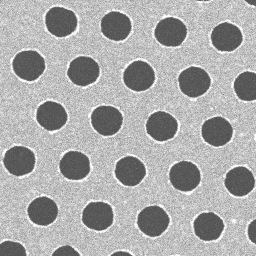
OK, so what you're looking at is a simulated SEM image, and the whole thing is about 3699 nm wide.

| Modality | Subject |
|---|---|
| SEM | a regular array of holes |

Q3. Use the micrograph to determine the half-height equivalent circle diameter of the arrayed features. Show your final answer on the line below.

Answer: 0.449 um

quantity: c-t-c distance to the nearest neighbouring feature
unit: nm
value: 792